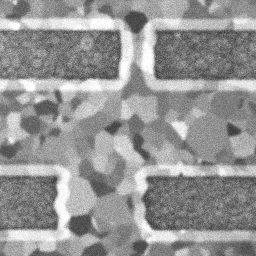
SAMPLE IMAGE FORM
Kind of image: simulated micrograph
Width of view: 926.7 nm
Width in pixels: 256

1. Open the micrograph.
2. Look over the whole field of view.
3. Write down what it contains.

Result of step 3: one or a few lines or trenches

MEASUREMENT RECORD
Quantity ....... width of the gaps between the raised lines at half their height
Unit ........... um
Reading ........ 0.222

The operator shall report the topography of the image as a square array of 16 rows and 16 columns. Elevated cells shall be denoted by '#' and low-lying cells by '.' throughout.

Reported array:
################
.......###......
........#.......
........#.......
........#.......
################
################
################
################
################
################
....#####.......
....#####.......
....#####.......
....#####.......
################